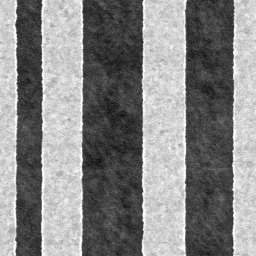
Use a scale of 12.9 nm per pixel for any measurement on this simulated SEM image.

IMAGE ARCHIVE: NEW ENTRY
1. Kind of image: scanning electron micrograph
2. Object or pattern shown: one or a few lines or trenches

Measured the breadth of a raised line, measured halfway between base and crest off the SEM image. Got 525 nm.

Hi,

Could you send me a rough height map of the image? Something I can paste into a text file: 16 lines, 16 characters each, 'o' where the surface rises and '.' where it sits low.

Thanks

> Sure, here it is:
o..oo....ooo...o
o..oo....ooo...o
o..oo....ooo...o
o..oo....ooo...o
o..oo....ooo...o
o..oo....ooo...o
o..oo....ooo...o
o..oo....ooo...o
o..oo....ooo...o
o..oo....ooo...o
o..oo....ooo...o
o..oo....ooo...o
o..oo....ooo...o
o..oo....ooo...o
o..oo....ooo...o
o..oo....ooo...o